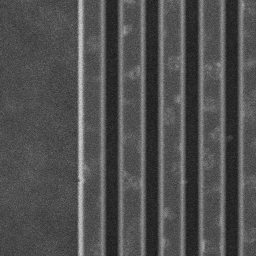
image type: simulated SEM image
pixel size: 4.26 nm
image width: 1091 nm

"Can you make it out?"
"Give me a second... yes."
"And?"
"parallel lines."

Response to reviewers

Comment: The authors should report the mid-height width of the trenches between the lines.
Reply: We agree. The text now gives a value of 69.5 nanometers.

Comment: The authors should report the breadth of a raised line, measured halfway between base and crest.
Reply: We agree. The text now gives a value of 0.101 micrometres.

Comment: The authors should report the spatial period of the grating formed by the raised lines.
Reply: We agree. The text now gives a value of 170 nm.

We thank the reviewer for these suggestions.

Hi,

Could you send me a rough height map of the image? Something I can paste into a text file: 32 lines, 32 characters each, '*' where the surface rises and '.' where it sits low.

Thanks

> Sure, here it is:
..........***..***..***..***..**
..........***..***..***..***..**
..........***..***..***..***..**
..........***..***..***..***..**
..........***..***..***..***..**
..........***..***..***..***..**
..........***..***..***..***..**
..........***..***..***..***..**
..........***..***..***..***..**
..........***..***..***..***..**
..........***..***..***..***..**
..........***..***..***..***..**
..........***..***..***..***..**
..........***..***..***..***..**
..........***..***..***..***..**
..........***..***..***..***..**
..........***..***..***..***..**
..........***..***..***..***..**
..........***..***..***..***..**
..........***..***..***..***..**
..........***..***..***..***..**
..........***..***..***..***..**
..........***..***..***..***..**
..........***..***..***..***..**
..........***..***..***..***..**
..........***..***..***..***..**
..........***..***..***..***..**
..........***..***..***..***..**
..........***..***..***..***..**
..........***..***..***..***..**
..........***..***..***..***..**
..........***..***..***..***..**